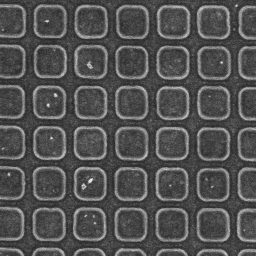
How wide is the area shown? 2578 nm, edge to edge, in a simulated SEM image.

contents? a regular array of raised bodies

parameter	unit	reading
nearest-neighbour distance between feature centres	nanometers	406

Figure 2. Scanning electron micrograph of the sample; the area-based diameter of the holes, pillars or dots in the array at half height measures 339 nanometers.